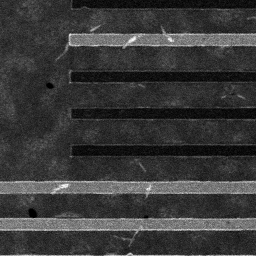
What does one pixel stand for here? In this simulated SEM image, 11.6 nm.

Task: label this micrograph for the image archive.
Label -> parallel lines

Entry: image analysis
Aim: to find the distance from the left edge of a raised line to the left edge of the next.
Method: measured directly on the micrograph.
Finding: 427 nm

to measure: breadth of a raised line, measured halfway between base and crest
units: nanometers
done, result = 136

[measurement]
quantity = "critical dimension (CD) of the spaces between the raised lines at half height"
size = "25.2 pixels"